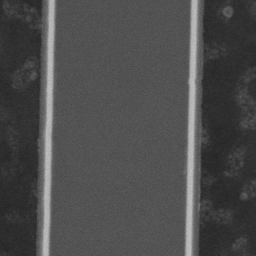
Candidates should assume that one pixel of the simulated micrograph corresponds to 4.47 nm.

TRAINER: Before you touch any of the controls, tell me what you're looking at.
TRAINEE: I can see one or a few lines or trenches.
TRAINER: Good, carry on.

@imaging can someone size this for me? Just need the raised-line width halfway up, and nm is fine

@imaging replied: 644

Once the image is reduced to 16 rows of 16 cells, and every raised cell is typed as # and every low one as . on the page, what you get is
...#########....
...#########....
...#########....
...#########....
...#########....
...#########....
...#########....
...#########....
...#########....
...#########....
...#########....
...#########....
...#########....
...#########....
...#########....
...#########....